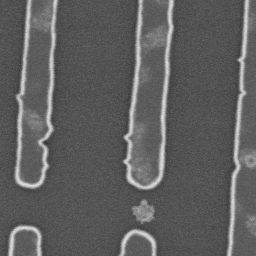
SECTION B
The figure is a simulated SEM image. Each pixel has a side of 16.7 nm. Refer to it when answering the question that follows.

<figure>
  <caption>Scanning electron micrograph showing one or a few lines or trenches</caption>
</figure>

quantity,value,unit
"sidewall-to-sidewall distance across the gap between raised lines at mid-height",1360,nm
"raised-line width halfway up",0.484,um